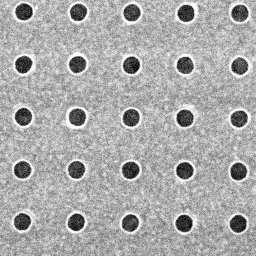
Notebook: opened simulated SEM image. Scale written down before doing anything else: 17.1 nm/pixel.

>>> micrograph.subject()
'a regular array of holes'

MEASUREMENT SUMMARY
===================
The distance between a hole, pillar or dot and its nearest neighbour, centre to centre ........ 896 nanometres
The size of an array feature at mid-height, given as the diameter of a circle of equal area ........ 18.2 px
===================